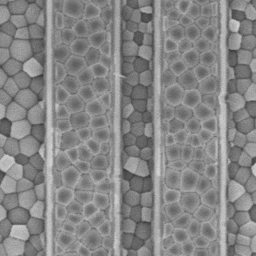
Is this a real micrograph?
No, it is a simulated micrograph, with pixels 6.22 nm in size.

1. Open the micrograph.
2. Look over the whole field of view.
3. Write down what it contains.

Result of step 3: one or a few lines or trenches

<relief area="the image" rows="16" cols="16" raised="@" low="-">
---@@@@---@@@@--
---@@@@---@@@@--
---@@@@---@@@@--
---@@@@---@@@@--
---@@@@---@@@@--
---@@@@---@@@@--
---@@@@---@@@@--
---@@@@---@@@@--
---@@@@---@@@@--
---@@@@---@@@@--
---@@@@---@@@@--
---@@@@---@@@@--
---@@@@---@@@@--
---@@@@---@@@@--
---@@@@---@@@@--
---@@@@---@@@@--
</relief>